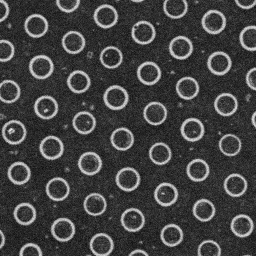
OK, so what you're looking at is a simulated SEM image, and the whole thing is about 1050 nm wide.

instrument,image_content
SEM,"a regular array of raised bodies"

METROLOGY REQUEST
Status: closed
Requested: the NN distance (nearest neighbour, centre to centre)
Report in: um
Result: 0.166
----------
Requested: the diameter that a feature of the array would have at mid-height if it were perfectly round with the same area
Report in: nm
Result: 86.2